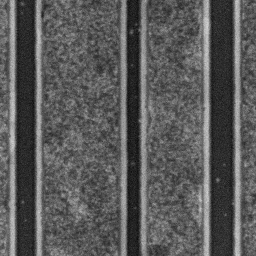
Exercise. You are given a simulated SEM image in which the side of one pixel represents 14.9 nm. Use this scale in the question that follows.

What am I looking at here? one or a few lines or trenches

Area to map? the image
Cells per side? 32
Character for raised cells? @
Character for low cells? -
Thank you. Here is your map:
@----@@@@@@@@@@---@@@@@@@@----@@
@----@@@@@@@@@@---@@@@@@@@----@@
@----@@@@@@@@@@---@@@@@@@@----@@
@----@@@@@@@@@@---@@@@@@@@----@@
@----@@@@@@@@@@---@@@@@@@@----@@
@----@@@@@@@@@@---@@@@@@@@----@@
@----@@@@@@@@@@---@@@@@@@@----@@
@----@@@@@@@@@@---@@@@@@@@----@@
@----@@@@@@@@@@---@@@@@@@@----@@
@----@@@@@@@@@@---@@@@@@@@----@@
@----@@@@@@@@@@---@@@@@@@@----@@
@----@@@@@@@@@@---@@@@@@@@----@@
@----@@@@@@@@@@---@@@@@@@@----@@
@----@@@@@@@@@@---@@@@@@@@----@@
@----@@@@@@@@@@---@@@@@@@@----@@
@----@@@@@@@@@@---@@@@@@@@----@@
@----@@@@@@@@@@---@@@@@@@@----@@
@----@@@@@@@@@@---@@@@@@@@----@@
@----@@@@@@@@@@---@@@@@@@@----@@
@----@@@@@@@@@@---@@@@@@@@----@@
@----@@@@@@@@@@---@@@@@@@@----@@
@----@@@@@@@@@@---@@@@@@@@----@@
@----@@@@@@@@@@---@@@@@@@@----@@
@----@@@@@@@@@@---@@@@@@@@----@@
@----@@@@@@@@@@---@@@@@@@@----@@
@----@@@@@@@@@@---@@@@@@@@----@@
@----@@@@@@@@@@---@@@@@@@@----@@
@----@@@@@@@@@@---@@@@@@@@----@@
@----@@@@@@@@@@---@@@@@@@@----@@
@----@@@@@@@@@@---@@@@@@@@----@@
@----@@@@@@@@@@---@@@@@@@@----@@
@----@@@@@@@@@@---@@@@@@@@----@@